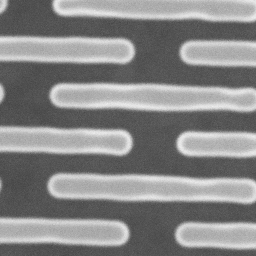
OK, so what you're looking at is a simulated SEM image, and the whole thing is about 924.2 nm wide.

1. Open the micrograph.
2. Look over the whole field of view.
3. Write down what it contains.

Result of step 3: groups of lines, slits or small figures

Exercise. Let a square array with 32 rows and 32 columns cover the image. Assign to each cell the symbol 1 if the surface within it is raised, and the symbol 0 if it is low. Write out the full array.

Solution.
10000001111111111111111111111111
00000001111111111111111111111111
00000000000000000000000000111111
00000000000000000000000000000000
00000000000000000000000000000000
11111111111111110000000111111111
11111111111111111000000111111111
00011111111111110000000111111111
00000000000000000000000000000000
00000000000000000000000000000000
00000000000000000000000000000000
00000011111111111111111111111111
00000011111111111111111111111111
00000000000000000111111111101111
00000000000000000000000000000000
00000000000000000000000000000000
11111111111111100000000000000000
11111111111111110000001111111111
11111111111111110000001111111111
00000000000000000000000000000110
00000000000000000000000000000000
00000000000000000000000000000000
00000011111111111111111100011100
00000011111111111111111111111111
00000001111111111111111111111111
00000000000000000000000000000000
00000000000000000000000000000000
11111000000000000000000000000000
11111111111111110000001111111111
11111111111111110000001111111111
00000000001111100000000111111111
00000000000000000000000000000000